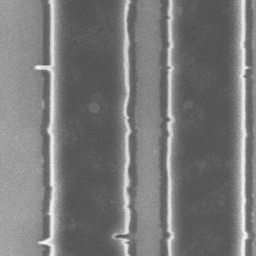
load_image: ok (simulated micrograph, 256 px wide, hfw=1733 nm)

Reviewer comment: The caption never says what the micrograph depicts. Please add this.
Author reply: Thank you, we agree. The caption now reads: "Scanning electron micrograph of one or a few lines or trenches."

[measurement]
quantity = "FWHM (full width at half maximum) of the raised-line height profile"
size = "514 nm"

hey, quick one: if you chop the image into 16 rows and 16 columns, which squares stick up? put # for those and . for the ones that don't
...#####...####.
...#####...####.
...#####...####.
...#####...####.
...#####...####.
...#####...####.
...#####...####.
...#####...####.
...#####...####.
...#####..#####.
...#####..#####.
...#####...####.
...#####...####.
...#####...####.
...#####...####.
...#####...####.